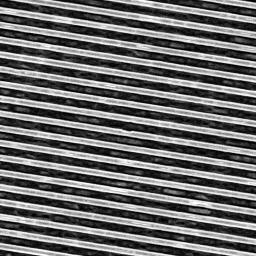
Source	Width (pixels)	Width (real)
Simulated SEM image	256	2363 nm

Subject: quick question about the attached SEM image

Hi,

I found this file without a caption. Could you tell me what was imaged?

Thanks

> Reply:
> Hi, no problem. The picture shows parallel lines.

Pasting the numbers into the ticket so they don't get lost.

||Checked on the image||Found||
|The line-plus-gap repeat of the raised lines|14.6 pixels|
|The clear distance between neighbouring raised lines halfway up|0.0878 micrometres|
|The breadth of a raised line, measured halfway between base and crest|47.9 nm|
